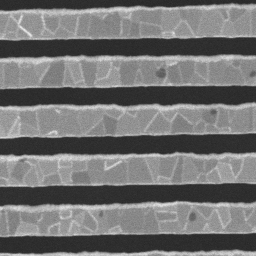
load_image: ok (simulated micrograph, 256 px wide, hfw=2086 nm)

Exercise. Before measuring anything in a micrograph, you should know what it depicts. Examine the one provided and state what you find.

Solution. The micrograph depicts lines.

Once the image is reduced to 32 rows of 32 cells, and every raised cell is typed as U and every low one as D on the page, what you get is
DDDDDDDDDDDDDDDDDDDDDDDDDDDDDDDD
UUUUUUUUUUUUUUUUUUUUUUUUUUUUUUUU
UUUUUUUUUUUUUUUUUUUUUUUUUUUUUUUU
UUUUUUUUUUUUUUUUUUUUUUUUUUUUUUUU
UUUUUUUUUUUUUUUUUUUUUUUUUUUUUUUU
DDDDDDDDDDDDDDDDDDDDDDDDDDDDDDDD
DDDDDDDDDDDDDDDDDDDDDDDDDDDDDDDD
UUUUUUUUUUUUUUUUUUUUUUUUUUUUUUUU
UUUUUUUUUUUUUUUUUUUUUUUUUUUUUUUU
UUUUUUUUUUUUUUUUUUUUUUUUUUUUUUUU
UUUUUUUUUUUUUUUUUUUUUUUUUUUUUUUU
DDDDDDDDDDDDDDDDDDDDDDDDDDDDDDDD
DDDDDDDDDDDDDDDDDDDDDDDDDDDDDDDD
UUUUUUUUUUUUUUUUUUUUUUUUUUUUUUUU
UUUUUUUUUUUUUUUUUUUUUUUUUUUUUUUU
UUUUUUUUUUUUUUUUUUUUUUUUUUUUUUUU
UUUUUUUUUUUUUUUUUUUUUUUUUUUUUUUU
DDDDDDDDDDDDDDDDDDDDDDDDDDDDDDDD
DDDDDDDDDDDDDDDDDDDDDDDDDDDDDDDD
UUUUUUUUUUUUUUUUUUUUUUUUUUUUUUUU
UUUUUUUUUUUUUUUUUUUUUUUUUUUUUUUU
UUUUUUUUUUUUUUUUUUUUUUUUUUUUUUUU
UUUUUUUUUUUUUUUUUUUUUUUUUUUUUUUU
DDDDDDDDDDDDDDDDDDDDDDDDDDDDDDDD
DDDDDDDDDDDDDDDDDDDDDDDDDDDDDDDD
DDDDDDDDDDDDDDUDUUUUUUUUUUUUUUUU
UUUUUUUUUUUUUUUUUUUUUUUUUUUUUUUU
UUUUUUUUUUUUUUUUUUUUUUUUUUUUUUUU
UUUUUUUUUUUUUUUUUUUUUUUUUUUUUUUU
UUDDDDDDDDDDDDDDDDDDDDDDDDDDDDDD
DDDDDDDDDDDDDDDDDDDDDDDDDDDDDDDD
DDDDDDDDDDDDUDDDDDUUUUDDUUUUUUUU